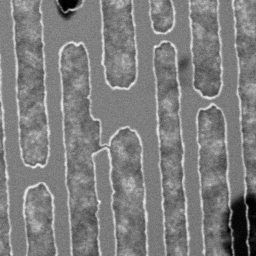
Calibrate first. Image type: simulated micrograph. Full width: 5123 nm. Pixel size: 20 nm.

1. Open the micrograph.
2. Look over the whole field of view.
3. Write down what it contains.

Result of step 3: parallel lines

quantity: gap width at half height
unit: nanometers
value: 542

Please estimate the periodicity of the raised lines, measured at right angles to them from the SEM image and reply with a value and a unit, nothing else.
884 nm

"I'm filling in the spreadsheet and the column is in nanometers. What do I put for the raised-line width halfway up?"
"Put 340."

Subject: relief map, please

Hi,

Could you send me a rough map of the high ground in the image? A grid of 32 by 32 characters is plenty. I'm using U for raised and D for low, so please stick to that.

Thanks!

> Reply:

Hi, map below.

UUDDDUUDDDUUUDDDDUUDDUUUDDDUUDDD
UUDDDUUUUUUUUDDDUUUDDDUUDDDUUDDD
UUDDDUUUUUUUUDDDDUUDDDUUDDDUUDDD
UUDDDUUUUUUUUDDDDUUDDUUUDDDUUDDD
UUDDDUUUUUUUUDDDDUUUUUUUDDDUUDDD
UUDDDUUUUUUUUDDDDUUUDUUUDDDDUDDD
UUDDDUUUDDDUUDDDDUUDDDUUDDDUUUDD
UUDDDUUUDDDUUDDDDUUDDDUUDDDDUUDD
UUDDDUUUDDDUUDDDDUUDDDUUDDDDUUDD
UUDDDDUUDDDUUDDDDUUUDDUUDDDDUUDD
UUDDDDUUDDDUUUDDUUUUDDUUDDDDUUDD
UUDDDDUUDDDUUUUUUUUUDDUUUDDUUUDD
UUDDDDUUDDDUUUUUUUUUDDUUUUUUUUDD
UUDDDDUUDDDUUUUUUUUUDDUUUUDUUUDD
UUDDDDUUDDDUUUUUUUUUDDUUUDDDUUDD
UUDDDDUUDDDDUUUUUUUUDDDUUDDDUUDD
UUDDDDUUDDDDDUUDDUUUDDDUUDDDUUDD
UUDDDDUUDDDDUUDDDUUUDDDUUDDDUUDD
UUUDDDUUDDDDDDDDDDUUDDDUUDDDUUDD
DUUDDDUUDDDDUUDDDDUUDDDUUDDDUUDD
DUUDDDUUDDDDUUDDDDUUDDDUUDDDUUUD
DUUUUUUUDDDDUUDDDDUUDDDUUDDDUUUD
DUUUUUUUDDDDUUDDDDUUDDDUUDDDUUUD
DUUUDDUUUDDDUUDDDDUUDDDUUDDDDUUD
DUUDDDUUUDDDUUDDDDUUDDDUUDDDDUUD
DUUDDDDUUDDDUUDDDDUUDDDUUDDDDUUD
DUUDDDDUUDDDUUDDDDUUDDDUUDDDDUUD
DUUDDDDUUDDDUUDDDDUUUDDUUDDDDUUD
DUUDDDDUUDDDUUDDDDUUUDDUUDDDDUUD
DUUDDDDUUDDDUUDDDDUUUDDUUDDDDUUD
DUUUDDDUUDDDUUUDDDUUUDDDUUDDDUUD
DUUDDDDUUDDDUUUDDDUUUDDDUUDDDUUD